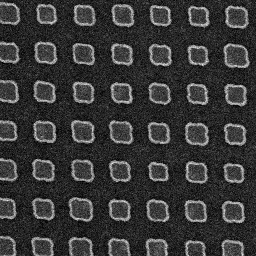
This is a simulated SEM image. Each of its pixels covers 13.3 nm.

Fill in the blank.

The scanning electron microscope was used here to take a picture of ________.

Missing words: a regular array of raised bodies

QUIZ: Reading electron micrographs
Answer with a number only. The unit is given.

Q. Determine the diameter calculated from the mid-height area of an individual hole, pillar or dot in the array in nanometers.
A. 279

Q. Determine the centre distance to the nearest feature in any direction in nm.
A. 502